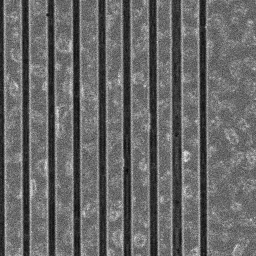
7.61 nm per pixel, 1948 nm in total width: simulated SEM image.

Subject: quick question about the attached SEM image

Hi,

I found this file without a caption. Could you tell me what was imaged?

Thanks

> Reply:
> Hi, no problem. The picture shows parallel lines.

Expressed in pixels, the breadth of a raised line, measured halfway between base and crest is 19.1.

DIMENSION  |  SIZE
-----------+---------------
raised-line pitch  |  193 nanometres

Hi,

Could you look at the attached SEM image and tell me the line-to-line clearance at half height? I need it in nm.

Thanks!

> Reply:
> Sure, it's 51.4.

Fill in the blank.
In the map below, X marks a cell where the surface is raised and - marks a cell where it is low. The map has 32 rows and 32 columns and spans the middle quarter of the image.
XX--XXXX---XXXX--XXXX--XXXX--XXX
XX--XXXX---XXXX--XXXX--XXXX--XXX
XX--XXXX---XXXX--XXXX--XXXX--XXX
XX--XXXX---XXXX--XXXX--XXXX--XXX
XX--XXXX---XXXX--XXXX--XXXX--XXX
XX--XXXX---XXXX--XXXX--XXXX--XXX
XX--XXXXX--XXXX--XXXX--XXXX--XXX
XX--XXXXX--XXXX--XXXX--XXXX--XXX
XX--XXXXX--XXXX--XXXX--XXXX---XX
XX--XXXXX--XXXX--XXXX--XXXX--XXX
XX--XXXXX--XXXX--XXXX--XXXX--XXX
XX--XXXXX--XXXX--XXXX--XXXX--XXX
XX--XXXXX--XXXX--XXXX--XXXX--XXX
XX--XXXXX--XXXX--XXXX--XXXX--XXX
XX--XXXXX--XXXX--XXXX--XXXX--XXX
XX--XXXXX--XXXX--XXXX--XXXX--XXX
XX--XXXXX--XXXX--XXXX--XXXX---XX
XX--XXXXX--XXXX--XXXX--XXXX---XX
XX--XXXXX--XXXX--XXXX--XXXX---XX
XX--XXXXX--XXXX--XXXX--XXXX---XX
XX--XXXXX--XXXX--XXXX--XXXX---XX
XX--XXXXX--XXXX--XXXX--XXXX---XX
XX--XXXXX--XXXX--XXXX--XXXX---XX
XX--XXXXX--XXXX--XXXX--XXXX---XX
XX--XXXXX--XXXX--XXXX--XXXX---XX
XX--XXXXX--XXXX--XXXX--XXXX---XX
XX--XXXXX--XXXX--XXXX--XXXX---XX
XX--XXXXX--XXXX--XXXX--XXXX---XX
XX--XXXXX--XXXX--XXXX--XXXX---XX
XX--XXXXX--XXXX--XXXX--XXXX---XX
XX--XXXXX--XXXX--XXXX--XXXX---XX
XX--XXXXX--XXXX--XXXX--XXXX---XX